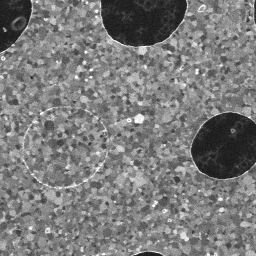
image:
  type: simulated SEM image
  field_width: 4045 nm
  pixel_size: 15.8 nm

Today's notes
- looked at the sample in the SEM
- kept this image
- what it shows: holes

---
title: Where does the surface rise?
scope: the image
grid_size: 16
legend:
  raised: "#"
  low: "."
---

..####......####
.#####.....#####
.######...######
################
################
################
################
###..########...
###...######....
###...######....
############....
################
################
################
################
################